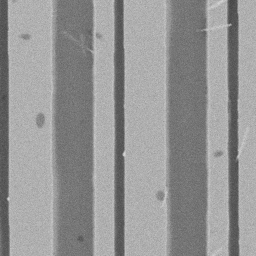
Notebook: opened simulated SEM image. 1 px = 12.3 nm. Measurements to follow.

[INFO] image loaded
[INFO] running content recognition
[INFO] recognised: lines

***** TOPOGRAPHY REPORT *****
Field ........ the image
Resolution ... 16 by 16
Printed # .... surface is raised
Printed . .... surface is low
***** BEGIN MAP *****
###...####...###
###...####...###
###...####...###
###...####...###
###...####...###
###...####...###
###...####...###
###...####...###
###...####...###
###...####...###
###...####...###
###...####...###
###...####...###
###...####...###
###...####...###
###...####...###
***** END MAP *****